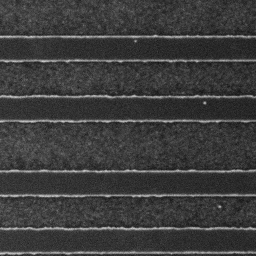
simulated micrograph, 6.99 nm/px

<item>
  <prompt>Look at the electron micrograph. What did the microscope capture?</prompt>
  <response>lines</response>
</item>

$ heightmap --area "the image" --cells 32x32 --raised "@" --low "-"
--------------------------------
--------------------------------
--------------------------------
--------------------------------
-------------------@----@---@@--
@@@@@@@@@@@@@@@@@@@@@@@@@@@@@@@@
@@@@@@@@@@@@@@@@@@@@@@@@@@@@@@@@
@@@@@@@@@@@@@@@@@@@@@@@@@@@@@@@@
--------------------------------
--------------------------------
--------------------------------
--------------------------------
@@@@@@@@@@@@@@@@@@@@@@@@@@@@@@@@
@@@@@@@@@@@@@@@@@@@@@@@@@@@@@@@@
@@@@@@@@@@@@@@@@@@@@@@@@@@@@@@@@
--------------------------------
--------------------------------
--------------------------------
--------------------------------
--------------------------------
--------------------------------
@@@@@@@@@@@@@@@@@@@@@@@@@@@@@@@@
@@@@@@@@@@@@@@@@@@@@@@@@@@@@@@@@
@@@@@@@@@@@@@@@@@@@@@@@@@@@@@@@@
@@@-@@@@@@@--@--@@@@@------@----
--------------------------------
--------------------------------
--------------------------------
-@@@-@@@---@@@@@@--@@@-@@-@@@@@@
@@@@@@@@@@@@@@@@@@@@@@@@@@@@@@@@
@@@@@@@@@@@@@@@@@@@@@@@@@@@@@@@@
@@@@@@@@@@@@@@@@@@@@@@@@@@@@@@@@